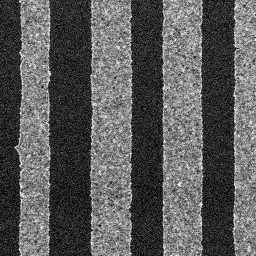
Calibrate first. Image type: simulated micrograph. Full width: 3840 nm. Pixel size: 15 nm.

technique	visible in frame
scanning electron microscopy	one or a few lines or trenches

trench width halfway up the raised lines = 0.502 µm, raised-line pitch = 1110 nm